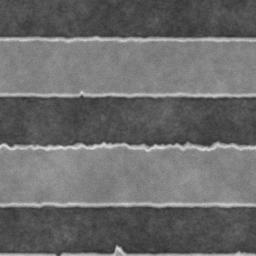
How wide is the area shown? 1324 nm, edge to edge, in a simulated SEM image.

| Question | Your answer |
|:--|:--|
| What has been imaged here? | one or a few lines or trenches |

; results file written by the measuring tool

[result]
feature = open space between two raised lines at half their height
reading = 252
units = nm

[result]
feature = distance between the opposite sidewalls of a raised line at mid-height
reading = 305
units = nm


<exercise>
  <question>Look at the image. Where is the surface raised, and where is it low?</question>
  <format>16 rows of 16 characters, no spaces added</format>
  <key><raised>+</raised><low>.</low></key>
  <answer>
................
................
++++++++++++++++
++++++++++++++++
++++++++++++++++
++++++++++++++++
................
................
................
++++++++++++++++
++++++++++++++++
++++++++++++++++
++++++++++++++++
................
................
................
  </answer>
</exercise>